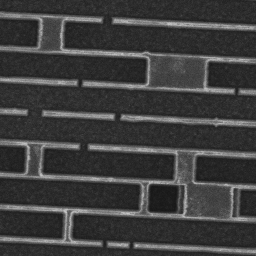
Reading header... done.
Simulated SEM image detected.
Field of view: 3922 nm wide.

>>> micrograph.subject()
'parallel lines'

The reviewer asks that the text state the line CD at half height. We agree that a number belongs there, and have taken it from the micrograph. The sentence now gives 68.8 nanometres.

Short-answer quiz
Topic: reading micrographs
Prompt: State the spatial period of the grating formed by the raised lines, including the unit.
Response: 488 nm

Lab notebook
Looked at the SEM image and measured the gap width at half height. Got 413 nm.